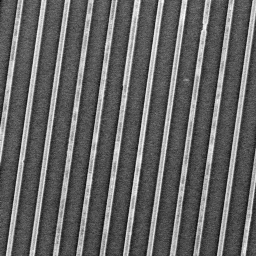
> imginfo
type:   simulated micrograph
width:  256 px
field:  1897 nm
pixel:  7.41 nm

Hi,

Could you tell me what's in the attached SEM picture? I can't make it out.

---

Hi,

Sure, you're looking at parallel lines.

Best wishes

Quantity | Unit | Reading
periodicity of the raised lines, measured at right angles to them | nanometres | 172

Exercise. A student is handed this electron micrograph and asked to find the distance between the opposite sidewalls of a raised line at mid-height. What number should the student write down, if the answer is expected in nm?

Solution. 33.9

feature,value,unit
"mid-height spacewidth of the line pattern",137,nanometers